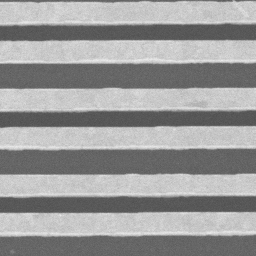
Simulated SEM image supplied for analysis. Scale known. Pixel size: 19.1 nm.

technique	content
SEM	lines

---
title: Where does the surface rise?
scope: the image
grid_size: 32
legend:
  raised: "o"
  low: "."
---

oooooooooooooooooooooooooooooooo
oooooooooooooooooooooooooooooooo
oooooooooooooooooooooooooooooooo
................................
................................
oooooooooooooooooooooooooooooooo
oooooooooooooooooooooooooooooooo
oooooooooooooooooooooooooooooooo
................................
................................
................................
oooooooooooooooooooooooooooooooo
oooooooooooooooooooooooooooooooo
oooooooooooooooooooooooooooooooo
................................
................................
oooooooooooooooooooooooooooooooo
oooooooooooooooooooooooooooooooo
oooooooooooooooo.ooooooo........
................................
................................
................................
oooooooooooooooooooooooooooooooo
oooooooooooooooooooooooooooooooo
..o.............................
................................
................................
oooooooooooooooooooooooooooooooo
oooooooooooooooooooooooooooooooo
................................
................................
................................